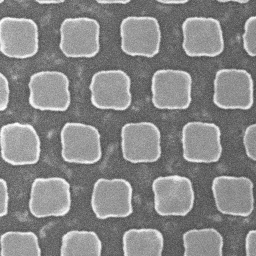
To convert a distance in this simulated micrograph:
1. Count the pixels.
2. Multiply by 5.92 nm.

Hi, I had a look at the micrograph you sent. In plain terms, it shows a regular array of raised bodies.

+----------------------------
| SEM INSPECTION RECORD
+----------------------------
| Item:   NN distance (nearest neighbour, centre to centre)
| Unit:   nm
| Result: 359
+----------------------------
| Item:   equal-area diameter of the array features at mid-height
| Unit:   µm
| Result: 0.244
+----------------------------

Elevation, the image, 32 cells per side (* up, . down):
................................
................................
****....***.....***....****....*
*****...****...*****...*****...*
*****...****...*****...*****...*
*****...****...*****...*****...*
****....****....****...*****...*
................................
................................
....****....****...*****...****.
*...****...*****...*****...****.
*...*****..*****...*****...*****
*...*****...****...*****...*****
.....***.....***.....**......**.
................................
................***.....**......
****....****...*****...****....*
*****...****...*****...****....*
*****...****...*****...****....*
*****...****...*****...****....*
................................
................................
......**....***.....***....****.
*...*****...****...*****...****.
*...*****...****...*****...*****
*...*****...****...*****...*****
*...****....****....***.....***.
................................
................................
****....****....****...*****...*
*****...****....****...*****...*
*****...*****...****...*****...*